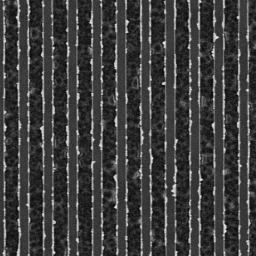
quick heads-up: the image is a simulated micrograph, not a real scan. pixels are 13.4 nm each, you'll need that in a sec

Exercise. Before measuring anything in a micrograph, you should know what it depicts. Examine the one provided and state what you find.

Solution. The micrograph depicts parallel lines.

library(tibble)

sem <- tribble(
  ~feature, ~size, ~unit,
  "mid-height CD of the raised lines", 0.217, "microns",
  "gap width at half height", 116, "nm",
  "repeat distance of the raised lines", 0.327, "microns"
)